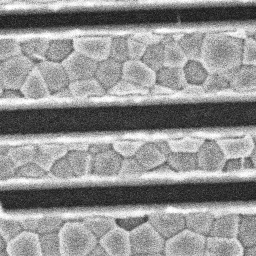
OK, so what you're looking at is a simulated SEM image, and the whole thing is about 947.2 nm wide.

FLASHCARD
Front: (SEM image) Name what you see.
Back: one or a few lines or trenches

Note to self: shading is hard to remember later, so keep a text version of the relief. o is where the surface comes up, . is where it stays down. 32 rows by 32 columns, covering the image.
oooooooooooooooooooooooooo......
................................
................................
...............ooooooooooooooooo
oooooooooooooooooooooooooooooooo
oooooooooooooooooooooooooooooooo
oooooooooooooooooooooooooooooooo
oooooooooooooooooooooooooooooooo
oooooooooooooooooooooooooooooooo
oooooooooooooooooooooooooooooooo
oooooooooooooooooooooooooooooooo
oooooooooooooooooooooooooooooooo
oooooooooooooooooooooo.oo.......
................................
................................
................................
.......................ooooooooo
oooooooooooooooooooooooooooooooo
oooooooooooooooooooooooooooooooo
oooooooooooooooooooooooooooooooo
oooooooooooooooooooooooooooooooo
oooooooooooooooooooooooooooooooo
ooooooooooooooooooooooo.........
................................
................................
................................
o...oooooooooooooooooooooooooooo
oooooooooooooooooooooooooooooooo
oooooooooooooooooooooooooooooooo
oooooooooooooooooooooooooooooooo
oooooooooooooooooooooooooooooooo
oooooooooooooooooooooooooooooooo